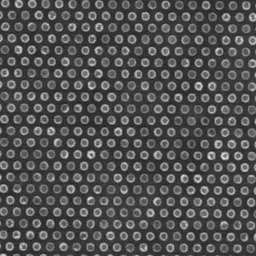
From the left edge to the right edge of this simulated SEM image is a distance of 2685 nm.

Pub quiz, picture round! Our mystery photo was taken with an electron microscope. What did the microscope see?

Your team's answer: a regular array of raised bodies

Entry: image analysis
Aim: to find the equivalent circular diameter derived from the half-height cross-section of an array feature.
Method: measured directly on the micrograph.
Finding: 87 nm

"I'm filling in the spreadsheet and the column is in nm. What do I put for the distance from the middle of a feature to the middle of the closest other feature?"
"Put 136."